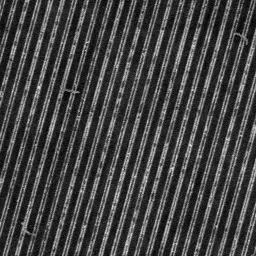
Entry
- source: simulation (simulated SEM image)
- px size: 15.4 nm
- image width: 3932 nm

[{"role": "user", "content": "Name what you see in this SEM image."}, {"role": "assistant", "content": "parallel lines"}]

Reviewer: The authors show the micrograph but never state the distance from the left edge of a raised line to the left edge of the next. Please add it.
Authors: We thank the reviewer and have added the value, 177 nm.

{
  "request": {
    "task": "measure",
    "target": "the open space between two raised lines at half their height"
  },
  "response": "128 nm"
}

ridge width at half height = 0.0574 microns